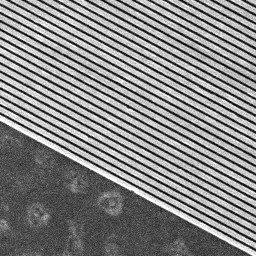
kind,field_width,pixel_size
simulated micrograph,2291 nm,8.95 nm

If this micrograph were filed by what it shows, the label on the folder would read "parallel lines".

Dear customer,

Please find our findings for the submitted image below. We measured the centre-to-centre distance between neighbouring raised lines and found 66.2 nanometres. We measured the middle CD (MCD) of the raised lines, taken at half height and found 45.3 nm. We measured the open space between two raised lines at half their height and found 22.7 nm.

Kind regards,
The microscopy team